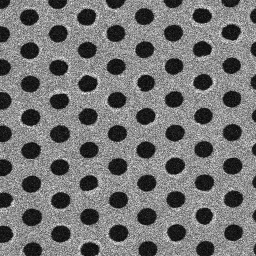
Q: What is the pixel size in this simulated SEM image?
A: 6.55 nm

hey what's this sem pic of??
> a regular array of holes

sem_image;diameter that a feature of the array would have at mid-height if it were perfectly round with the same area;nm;117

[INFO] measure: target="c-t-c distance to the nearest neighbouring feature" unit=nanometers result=216